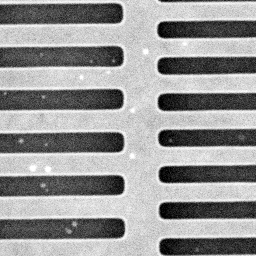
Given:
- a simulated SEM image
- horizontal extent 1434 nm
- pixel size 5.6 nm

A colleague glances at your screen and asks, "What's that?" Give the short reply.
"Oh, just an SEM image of groups of lines, slits or small figures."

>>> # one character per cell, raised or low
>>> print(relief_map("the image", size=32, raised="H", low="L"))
LLLLLLLLLLLLLLLHHHHHHHHHHHHHHHHH
LLLLLLLLLLLLLLLLHHHHHHHHHHHHHHHH
LLLLLLLLLLLLLLLHHHHHHHHLLLLLLLLL
HHHHHHHHHHHHHHHHHHHHLLLLLLLLLLLL
HHHHHHHHHHHHHHHHHHHHLLLLLLLLLLLL
HHHHHHHHHHHHHHHHHHHHHHHHHHHHHHHH
LLLLLLLLLLLLLLLLHHHHHHHHHHHHHHHH
LLLLLLLLLLLLLLLLHHHHLLLLLLLLLLLL
LLLLLLHHHHHHHHHHHHHHLLLLLLLLLLLL
HHHHHHHHHHHHHHHHHHHHHHHHHHHHHHHH
HHHHHHHHHHHHHHHHHHHHHHHHHHHHHHHH
LLLLLLLLLLLLLLLHHHHHHHHHHLLLLLLL
LLLLLLLLLLLLLLLLHHHHLLLLLLLLLLLL
LLLLLLLLLLLLLLLHHHHHLLLLLLLLLLLL
HHHHHHHHHHHHHHHHHHHHHHHHHHHHHHHH
HHHHHHHHHHHHHHHHHHHHHHHHHHHHHHHH
HHHLLLLLLLLLLLLHHHHHLLLLLLLLLLLL
LLLLLLLLLLLLLLLLHHHHLLLLLLLLLLLL
LLLLLLLLLLLLLLLLHHHHHHHHHHHHHHHH
HHHHHHHHHHHHHHHHHHHHHHHHHHHHHHHH
HHHHHHHHHHHHHHHHHHHHHHHHHHHHHHLL
HHHHHHHHHHHHHHHHHHHHLLLLLLLLLLLL
LLLLLLLLLLLLLLLLHHHHLLLLLLLLLLLL
LLLLLLLLLLLLLLLLHHHHHHHHHHHHHHHH
LLLLLLLLLLLLLLHHHHHHHHHHHHHHHHHH
HHHHHHHHHHHHHHHHHHHHLLLLLLLLLLLL
HHHHHHHHHHHHHHHHHHHHLLLLLLLLLLLL
LLLLLLLLLLLLLLLHHHHHHLLLLLLLLLLL
LLLLLLLLLLLLLLLLHHHHHHHHHHHHHHHH
LLLLLLLLLLLLLLLHHHHHHHHHHHHHHHHH
HHHHHHHHHHHHHHHHHHHHLLLLLLLLLLLL
HHHHHHHHHHHHHHHHHHHHLLLLLLLLLLLL